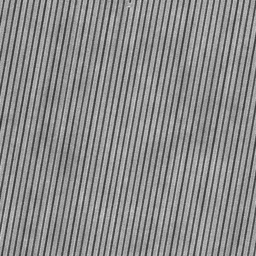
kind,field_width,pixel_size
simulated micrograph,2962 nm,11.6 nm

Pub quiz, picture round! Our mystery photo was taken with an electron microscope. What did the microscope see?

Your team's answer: parallel lines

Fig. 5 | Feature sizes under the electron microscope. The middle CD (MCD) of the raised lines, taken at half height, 41.3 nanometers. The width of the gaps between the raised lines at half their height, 30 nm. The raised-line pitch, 5.91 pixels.